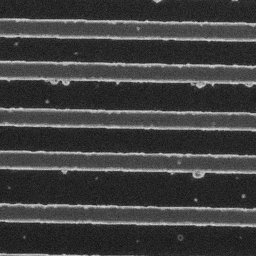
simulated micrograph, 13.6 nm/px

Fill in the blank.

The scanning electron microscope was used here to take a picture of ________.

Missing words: lines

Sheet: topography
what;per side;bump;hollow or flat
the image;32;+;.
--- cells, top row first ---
................................
................................
++++............................
++++++++++++++++++++++++++++++++
++++++++++++++++++++++++++++++++
................................
................................
................................
++++++++++++++++++++++++++++++++
++++++++++++++++++++++++++++++++
........................++......
................................
................................
................................
++++++++++++++++++++++++++++++++
++++++++++++++++++++++++++++++++
................................
................................
................................
+++++++++++++++++++++++++++++...
++++++++++++++++++++++++++++++++
.......................+++++++++
................................
................................
................................
++..............................
++++++++++++++++++++++++++++++++
++++++++++++++++++++++++++++++++
................................
................................
................................
................................